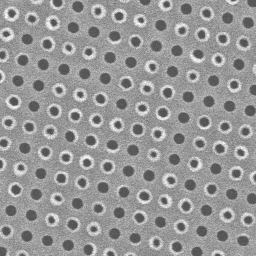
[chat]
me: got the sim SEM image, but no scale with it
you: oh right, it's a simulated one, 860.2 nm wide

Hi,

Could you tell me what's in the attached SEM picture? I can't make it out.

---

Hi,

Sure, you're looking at a regular array of holes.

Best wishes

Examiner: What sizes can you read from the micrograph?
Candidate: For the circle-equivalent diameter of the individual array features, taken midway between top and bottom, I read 36.2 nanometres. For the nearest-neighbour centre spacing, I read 70.4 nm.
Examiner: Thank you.